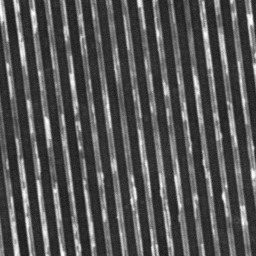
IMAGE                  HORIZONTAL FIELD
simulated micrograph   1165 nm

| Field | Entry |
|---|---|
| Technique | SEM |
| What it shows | parallel lines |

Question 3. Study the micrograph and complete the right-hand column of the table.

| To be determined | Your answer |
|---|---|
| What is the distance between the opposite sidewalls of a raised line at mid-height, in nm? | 21.4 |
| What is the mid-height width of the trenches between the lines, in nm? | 46.2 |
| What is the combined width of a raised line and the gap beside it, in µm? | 0.0696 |